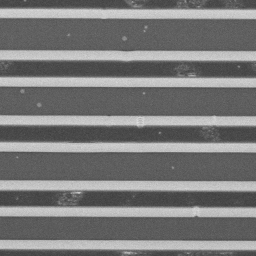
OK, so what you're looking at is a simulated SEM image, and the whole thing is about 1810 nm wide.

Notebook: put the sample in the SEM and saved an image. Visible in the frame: one or a few lines or trenches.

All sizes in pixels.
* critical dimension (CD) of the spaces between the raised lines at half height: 38.9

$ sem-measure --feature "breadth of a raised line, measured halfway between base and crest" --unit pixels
26.2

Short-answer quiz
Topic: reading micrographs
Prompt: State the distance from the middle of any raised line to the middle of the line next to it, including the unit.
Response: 459 nm